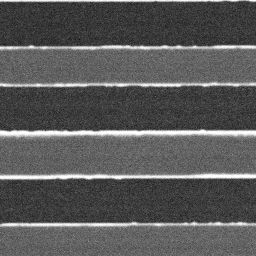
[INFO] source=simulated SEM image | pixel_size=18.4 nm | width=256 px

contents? lines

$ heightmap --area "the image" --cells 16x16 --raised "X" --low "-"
----------------
----------------
----------------
XXXXXXXXXXXXXXXX
XXXXXXXXXXXXXXXX
----------------
----------------
----------------
XXXXXXXXXXXXXXXX
XXXXXXXXXXXXXXXX
XXXXXXXXXXXXXXXX
----------------
----------------
----------------
XXXXXXXXXXXXXXXX
XXXXXXXXXXXXXXXX